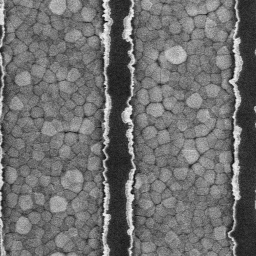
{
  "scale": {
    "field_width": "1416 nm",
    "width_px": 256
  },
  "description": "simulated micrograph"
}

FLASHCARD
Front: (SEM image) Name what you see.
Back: one or a few lines or trenches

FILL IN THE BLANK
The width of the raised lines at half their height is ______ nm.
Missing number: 146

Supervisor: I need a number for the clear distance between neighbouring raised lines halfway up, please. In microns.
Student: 0.566